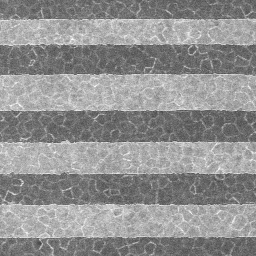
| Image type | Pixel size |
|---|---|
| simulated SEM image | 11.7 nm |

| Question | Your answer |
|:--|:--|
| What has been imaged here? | one or a few lines or trenches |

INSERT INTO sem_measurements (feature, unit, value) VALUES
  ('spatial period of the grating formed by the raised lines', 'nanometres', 739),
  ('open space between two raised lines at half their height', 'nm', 363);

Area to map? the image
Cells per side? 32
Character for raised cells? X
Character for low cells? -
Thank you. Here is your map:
--------------------------------
--------------------------------
-----XXXX-----XXXXXXXXXX---XXXXX
XXXXXXXXXXXXXXXXXXXXXXXXXXXXXXXX
XXXXXXXXXXXXXXXXXXXXXXXXXXXXXXXX
XXXXXXXXXXXXXXXXXXXX--XX---XXXXX
--------------------------------
--------------------------------
--------------------------------
XXXXXXXXXXXXXXXXXXXXXXXXXXXXXXXX
XXXXXXXXXXXXXXXXXXXXXXXXXXXXXXXX
XXXXXXXXXXXXXXXXXXXXXXXXXXXXXXXX
XXXXXXXXXXXXXXXXXXXXXXXXXXXXXXXX
XXXXXXXXXXXXXXXXXXXXXXXXXXXXXXXX
--------------------------------
--------------------------------
--------------------------------
--------------------------------
XXXXXXXXXXXXXXXXXXXXXXXXXXXXXXXX
XXXXXXXXXXXXXXXXXXXXXXXXXXXXXXXX
XXXXXXXXXXXXXXXXXXXXXXXXXXXXXXXX
XXXXXXXXXXXXXXXXXXXXXXXXXXXXXXXX
--------------------------------
--------------------------------
------------X-------------------
------------X-----------------XX
XXXXXXXXXXXXXXXXXXXXXXXXXXXXXXXX
XXXXXXXXXXXXXXXXXXXXXXXXXXXXXXXX
XXXXXXXXXXXXXXXXXXXXXXXXXXXXXXXX
XXXXXXXXXXXXXXXXXXXXXXXXXXXXXXXX
--------------------------------
--------------------------------